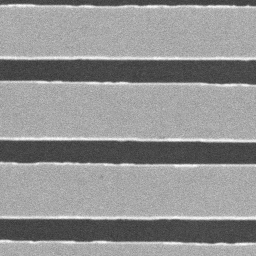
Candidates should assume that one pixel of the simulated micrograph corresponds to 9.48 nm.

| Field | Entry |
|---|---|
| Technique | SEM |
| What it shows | lines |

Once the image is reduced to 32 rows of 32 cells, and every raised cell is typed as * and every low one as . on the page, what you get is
................................
********************************
********************************
********************************
********************************
********************************
********************************
................................
................................
................................
**************************......
********************************
********************************
********************************
********************************
********************************
********************************
...............*.***************
................................
................................
***.******.*....................
********************************
********************************
********************************
********************************
********************************
********************************
................................
................................
................................
**************************.*****
********************************